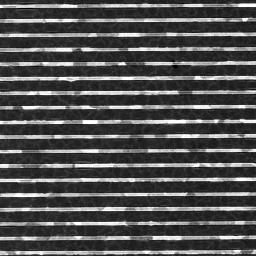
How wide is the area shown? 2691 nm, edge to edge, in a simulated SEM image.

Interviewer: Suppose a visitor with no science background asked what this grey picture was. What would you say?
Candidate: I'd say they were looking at parallel lines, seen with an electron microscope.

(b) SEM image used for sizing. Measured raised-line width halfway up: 31.5 nm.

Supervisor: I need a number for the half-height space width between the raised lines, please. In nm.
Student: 124